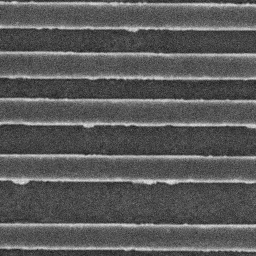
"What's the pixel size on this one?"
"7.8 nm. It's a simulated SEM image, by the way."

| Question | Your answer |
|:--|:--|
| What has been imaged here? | lines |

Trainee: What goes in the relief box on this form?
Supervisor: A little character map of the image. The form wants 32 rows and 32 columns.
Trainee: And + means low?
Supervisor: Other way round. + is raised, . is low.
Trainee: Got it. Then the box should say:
+++++++++++++++++++++++++++++...
++++++++++++++++++++++++++++++++
++++++++++++++++++++++++++++++++
....+..+++++++++++++++++++++++++
................................
................................
................................
++++++++++++++++++++++++++++++++
++++++++++++++++++++++++++++++++
++++++++++++++++++++++++++++++++
................................
................................
+++++++++++++++++++++++.........
++++++++++++++++++++++++++++++++
++++++++++++++++++++++++++++++++
...+++++++++++++++++++++++++++++
................................
................................
................................
++++++++++++....................
++++++++++++++++++++++++++++++++
++++++++++++++++++++++++++++++++
..+...+.++++++++++++++++++++++++
................................
................................
................................
................................
................................
++++++++++++++++++++++++++++++++
++++++++++++++++++++++++++++++++
++++++++++++++++++++++++++++++++
................................